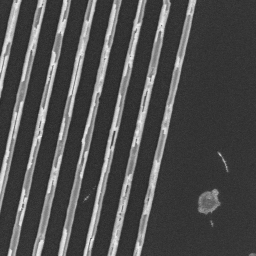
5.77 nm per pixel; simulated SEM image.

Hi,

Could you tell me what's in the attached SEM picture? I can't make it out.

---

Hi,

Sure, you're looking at parallel lines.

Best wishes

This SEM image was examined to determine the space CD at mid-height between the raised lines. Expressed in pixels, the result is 16.9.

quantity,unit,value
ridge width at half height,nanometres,43.6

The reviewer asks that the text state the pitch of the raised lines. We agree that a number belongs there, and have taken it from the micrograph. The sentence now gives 141 nanometers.